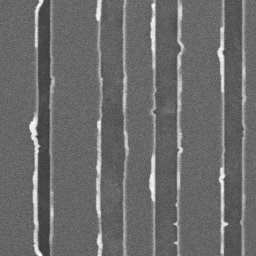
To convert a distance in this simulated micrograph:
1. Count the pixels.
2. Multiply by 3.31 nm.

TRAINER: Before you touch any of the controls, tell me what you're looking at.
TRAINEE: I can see one or a few lines or trenches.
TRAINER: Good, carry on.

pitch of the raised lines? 62.6 pixels